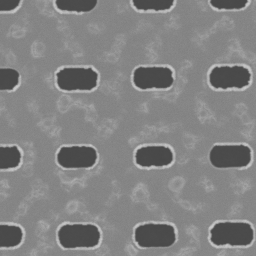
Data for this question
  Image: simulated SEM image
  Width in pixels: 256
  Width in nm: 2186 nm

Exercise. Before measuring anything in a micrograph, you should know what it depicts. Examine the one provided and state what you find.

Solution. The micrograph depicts a regular array of holes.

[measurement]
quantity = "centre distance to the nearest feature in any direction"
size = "76.7 pixels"